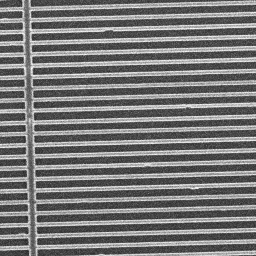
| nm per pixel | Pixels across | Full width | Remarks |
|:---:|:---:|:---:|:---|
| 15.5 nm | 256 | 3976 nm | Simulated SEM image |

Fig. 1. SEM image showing parallel lines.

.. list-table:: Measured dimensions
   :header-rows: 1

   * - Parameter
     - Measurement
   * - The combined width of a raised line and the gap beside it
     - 0.176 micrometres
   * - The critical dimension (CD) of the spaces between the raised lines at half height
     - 130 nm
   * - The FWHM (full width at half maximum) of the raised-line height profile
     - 0.0582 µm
